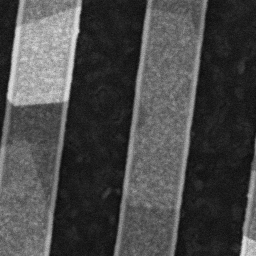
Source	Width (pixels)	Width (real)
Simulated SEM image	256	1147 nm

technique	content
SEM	one or a few lines or trenches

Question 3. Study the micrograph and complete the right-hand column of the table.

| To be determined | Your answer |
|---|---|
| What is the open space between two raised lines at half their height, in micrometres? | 0.314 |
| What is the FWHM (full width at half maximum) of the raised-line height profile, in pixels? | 55.6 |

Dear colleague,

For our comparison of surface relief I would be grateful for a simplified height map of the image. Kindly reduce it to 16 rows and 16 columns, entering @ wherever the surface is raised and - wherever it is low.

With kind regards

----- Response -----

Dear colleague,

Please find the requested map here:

-@@@@----@@@@---
-@@@@----@@@@---
-@@@@----@@@@---
-@@@-----@@@----
-@@@-----@@@----
-@@@-----@@@----
-@@@-----@@@----
@@@@----@@@@----
@@@@----@@@@----
@@@@----@@@@----
@@@@----@@@-----
@@@-----@@@-----
@@@-----@@@-----
@@@-----@@@----@
@@@----@@@@----@
@@@----@@@@----@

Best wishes